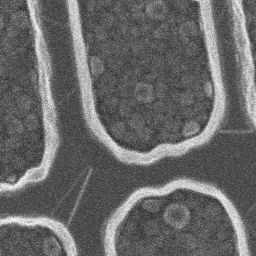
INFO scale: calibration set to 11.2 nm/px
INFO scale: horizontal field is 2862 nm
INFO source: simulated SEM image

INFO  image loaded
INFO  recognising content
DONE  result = one or a few lines or trenches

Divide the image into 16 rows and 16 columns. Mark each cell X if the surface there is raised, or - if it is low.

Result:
--XXX--------XX-
--XXX--------XX-
--XXX--------XX-
---XX--------XX-
---XX--------XXX
---XX---------XX
---XXX--------XX
---XXX-------XXX
---XXXX------XXX
---XXXXX--XXXXXX
---XXXXXXXXXXXXX
-XXXXXXXXXXXXXXX
XXXXXXXX------XX
XXXXXXXX-------X
----XXX--------X
----XXX--------X